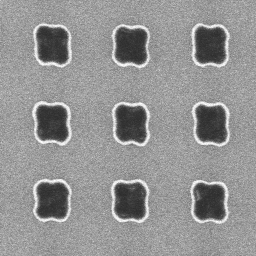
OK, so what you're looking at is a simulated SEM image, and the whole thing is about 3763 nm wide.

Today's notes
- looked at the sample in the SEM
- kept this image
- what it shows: a regular array of raised bodies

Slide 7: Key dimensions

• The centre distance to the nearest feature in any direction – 1140 nanometres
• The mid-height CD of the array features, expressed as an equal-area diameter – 603 nanometres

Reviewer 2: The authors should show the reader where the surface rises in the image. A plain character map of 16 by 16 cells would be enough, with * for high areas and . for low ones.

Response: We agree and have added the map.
................
................
..**...**...**..
..**...**...**..
................
................
................
..**...**...**..
..**...**...**..
................
................
..**...**...**..
..**...**...**..
..**...**...**..
................
................